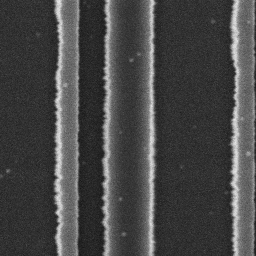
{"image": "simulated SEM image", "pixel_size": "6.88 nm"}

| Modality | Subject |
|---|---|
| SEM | lines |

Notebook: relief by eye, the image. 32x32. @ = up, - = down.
-------@@@---@@@@@@-----------@@
-------@@@---@@@@@@----------@@@
-------@@@---@@@@@@----------@@@
-------@@@---@@@@@@----------@@@
--------@@---@@@@@@----------@@@
--------@@---@@@@@@----------@@@
--------@@---@@@@@@----------@@@
-------@@@---@@@@@@----------@@@
-------@@@---@@@@@@-----------@@
-------@@@---@@@@@@-----------@@
-------@@@---@@@@@@-----------@@
-------@@@---@@@@@@-----------@@
-------@@@---@@@@@@-----------@@
-------@@@---@@@@@@-----------@@
-------@@@---@@@@@@----------@@@
-------@@@---@@@@@@----------@@@
-------@@@---@@@@@@-----------@@
-------@@@---@@@@@@----------@@@
-------@@@---@@@@@@----------@@@
-------@@@---@@@@@@----------@@@
-------@@@---@@@@@@-----------@@
-------@@@---@@@@@@----------@@@
-------@@@---@@@@@@----------@@@
-------@@@---@@@@@@----------@@@
-------@@@---@@@@@@----------@@@
-------@@@---@@@@@@----------@@@
-------@@@---@@@@@@----------@@@
-------@@@---@@@@@@----------@@@
-------@@@---@@@@@@----------@@@
-------@@@---@@@@@@----------@@@
-------@@@---@@@@@@----------@@@
-------@@@---@@@@@@----------@@@